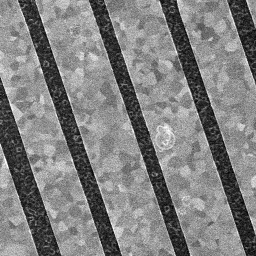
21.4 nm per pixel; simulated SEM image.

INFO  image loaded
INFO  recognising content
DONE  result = one or a few lines or trenches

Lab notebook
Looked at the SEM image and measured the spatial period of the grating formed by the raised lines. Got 1.39 um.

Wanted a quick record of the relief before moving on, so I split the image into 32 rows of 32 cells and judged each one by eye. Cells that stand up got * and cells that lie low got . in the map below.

**...******..*******..******...*
***..*******..******..*******..*
***..*******..*******..******...
***...******..*******..*******..
****..*******..******...******..
****..*******..*******..******..
****...******..*******..*******.
*****..*******..******..*******.
*****..*******..*******..******.
*****...******..*******..*******
******..*******..******...******
.*****..*******..*******..******
.*****...******..*******..******
.******..*******..*******..*****
..*****..*******..*******..*****
..*****...******..*******..*****
..******..*******..*******..****
...*****..*******..*******..****
...******..******..*******..****
*..******..*******..*******..***
*...*****..*******..*******..***
*...******..******..*******..***
**..******..*******..*******..**
**...*****..*******..*******..**
**...******..******..*******..**
***..******..*******..*******..*
***...*****..*******..*******..*
***...******..******..*******..*
****...*****..*******..*******..
****...*****..*******..*******..
****...******..******..*******..
*****...*****..*******..*******.